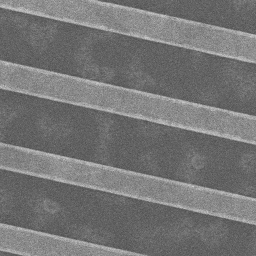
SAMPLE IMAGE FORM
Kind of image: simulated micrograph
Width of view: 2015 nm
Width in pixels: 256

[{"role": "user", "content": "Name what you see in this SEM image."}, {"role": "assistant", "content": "one or a few lines or trenches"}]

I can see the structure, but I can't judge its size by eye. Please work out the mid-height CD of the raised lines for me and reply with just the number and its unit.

0.202 µm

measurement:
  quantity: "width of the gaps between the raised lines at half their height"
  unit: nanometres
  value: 435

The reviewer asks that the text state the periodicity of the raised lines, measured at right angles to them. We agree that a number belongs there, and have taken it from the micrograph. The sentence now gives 0.624 um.